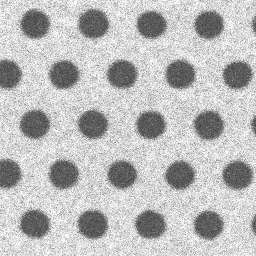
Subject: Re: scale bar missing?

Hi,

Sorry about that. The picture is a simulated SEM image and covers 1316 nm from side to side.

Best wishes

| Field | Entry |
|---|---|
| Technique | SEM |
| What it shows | a regular array of holes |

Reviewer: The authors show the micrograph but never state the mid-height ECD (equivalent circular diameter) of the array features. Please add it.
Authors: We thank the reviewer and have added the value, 151 nm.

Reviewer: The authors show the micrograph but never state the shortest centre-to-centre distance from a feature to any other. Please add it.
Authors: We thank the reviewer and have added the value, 295 nanometers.